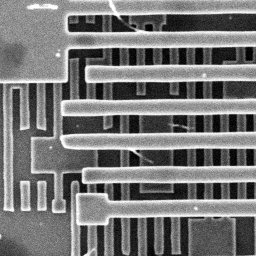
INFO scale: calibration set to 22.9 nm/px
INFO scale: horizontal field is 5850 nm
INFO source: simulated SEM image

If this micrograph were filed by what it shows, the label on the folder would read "wiring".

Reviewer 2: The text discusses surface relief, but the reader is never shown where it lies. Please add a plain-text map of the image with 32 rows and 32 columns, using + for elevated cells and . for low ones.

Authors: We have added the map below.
++++++++++++++++++++++++++++++++
++++++++++++++++++++++++++++++++
++++++++........................
++++++++........................
++++++++++++++++++++++++++++++++
++++++++++++++++++++++++++++++++
++++++++........................
++++++++........................
++++++++...+++++++++++++++++++++
++++++++...+++++++++++++++++++++
................................
................................
...................+++++++++++++
........++++++++++++++++++++++++
................................
................................
................................
........++++++++++++++++++++++++
........+++++++++++++++++.++++++
................................
................................
..........++++++++++++++++++++++
..........++++++++++++++++++++++
................................
..........+++...................
..........++++++++++++++++++++++
..........++++++++++++++++++++++
..........++++..................
................................
................................
................................
................................